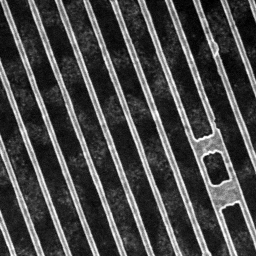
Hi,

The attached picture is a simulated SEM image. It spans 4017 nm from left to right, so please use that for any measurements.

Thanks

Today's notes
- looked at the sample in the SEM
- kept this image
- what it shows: parallel lines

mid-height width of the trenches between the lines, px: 20.8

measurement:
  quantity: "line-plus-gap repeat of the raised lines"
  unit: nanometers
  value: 406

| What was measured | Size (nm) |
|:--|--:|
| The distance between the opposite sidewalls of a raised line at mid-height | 71.9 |